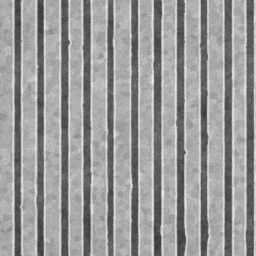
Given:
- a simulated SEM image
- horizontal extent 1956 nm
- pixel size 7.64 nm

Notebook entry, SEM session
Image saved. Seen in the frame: parallel lines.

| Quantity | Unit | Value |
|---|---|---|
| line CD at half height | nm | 115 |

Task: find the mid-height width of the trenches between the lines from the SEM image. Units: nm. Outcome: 66.9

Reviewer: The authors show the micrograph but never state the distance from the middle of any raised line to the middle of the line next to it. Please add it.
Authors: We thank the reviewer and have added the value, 0.178 µm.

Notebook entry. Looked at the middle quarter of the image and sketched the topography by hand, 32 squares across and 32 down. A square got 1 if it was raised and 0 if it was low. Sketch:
01111001110001111001110001110011
01111001110001111001110001110011
01111001110001111001110001110011
01111001110001111001110001110011
01111001110001110001110001110011
01111001110001110001110001110011
01111001110001110001110001110011
01111001110001110001110001110011
01111001110001110001110001110011
01111001110001110001110001110011
01111001110001111001110001110011
01111001110001111001110001110011
01111001110001111001110001110011
01111001110001111001110001110011
01111001110001110001110001110011
01111001111001110001110001110011
01111001111001110001110001110011
01111001111001110001110001110011
01111001111001111001110001110011
01111001110001111001110001110011
01111001110001111001110001110011
01111001111001111001110001110011
01111001110001111001110001110001
01111001110001111001110001110011
01111001111001111001110001110011
01111001111001111001110001110011
01111001111001111001110001110011
01111001111001111001110001110011
01111001111001111001110001110011
01111001111001111001110001110011
01111001111001111001110001110011
01111001111001111001110001110011